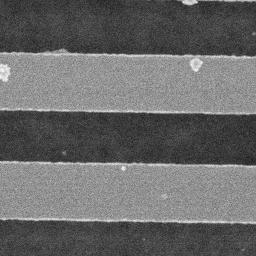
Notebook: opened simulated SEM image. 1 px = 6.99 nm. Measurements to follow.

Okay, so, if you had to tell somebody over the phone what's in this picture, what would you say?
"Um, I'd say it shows lines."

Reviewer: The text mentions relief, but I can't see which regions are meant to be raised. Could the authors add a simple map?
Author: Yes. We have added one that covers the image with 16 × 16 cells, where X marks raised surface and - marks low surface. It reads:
----------------
----------------
----------------
XXXXXXXXXXXXXX--
XXXXXXXXXXXXXXXX
XXXXXXXXXXXXXXXX
XXXXXXXXXXXXXXXX
----------------
----------------
----------------
XXXXXXXXXXXXXXXX
XXXXXXXXXXXXXXXX
XXXXXXXXXXXXXXXX
XXXXXXXXXXXXXXXX
----------------
----------------